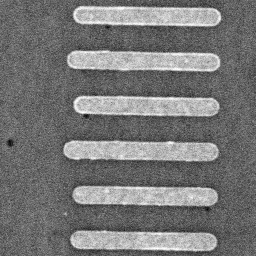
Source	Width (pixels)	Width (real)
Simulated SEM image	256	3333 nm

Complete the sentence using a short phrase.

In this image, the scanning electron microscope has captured groups of lines, slits or small figures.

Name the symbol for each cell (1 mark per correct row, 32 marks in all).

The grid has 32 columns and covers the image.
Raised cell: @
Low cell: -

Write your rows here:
--------------------------------
---------@@@@@@@@@@@@@@@@@@-----
----------@@@@@@@@@@@@@@@@@-----
--------------------------------
--------------------------------
--------------------------------
--------------------------------
--------@@@@@@@@@@@@@@@@@@@-----
---------@@@@@@@@@@@@@@@@@@-----
--------------------------------
--------------------------------
--------------------------------
----------@@@@@@@@@@@@@@@@@-----
---------@@@@@@@@@@@@@@@@@@-----
--------------------------------
--------------------------------
--------------------------------
--------------------------------
--------@@@@@@@@@@@@@@@@@@@-----
---------@@@@@@@@@@@@@@@@@@-----
--------------------------------
--------------------------------
--------------------------------
----------@@@@@@@---------------
---------@@@@@@@@@@@@@@@@@@-----
------------------@@@@@@@@@-----
--------------------------------
--------------------------------
--------------------------------
---------@@@@@@@@@@@@@@@@@@-----
---------@@@@@@@@@@@@@@@@@@-----
--------------------------------